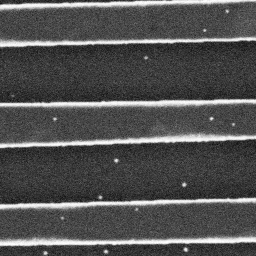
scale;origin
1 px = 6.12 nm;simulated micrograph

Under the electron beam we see lines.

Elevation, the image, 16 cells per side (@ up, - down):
@@@@@@@@@@@@@@@@
@@@@@@@@@@@@@@@@
@@@@@@@@@@@@@@@-
----------------
----------------
----------------
@@@@@@@@@@@@@@@@
@@@@@@@@@@@@@@@@
@@@@@@@@@@@@@@@@
----------------
----------------
----------------
-------------@@@
@@@@@@@@@@@@@@@@
@@@@@@@@@@@@@@@@
----------------